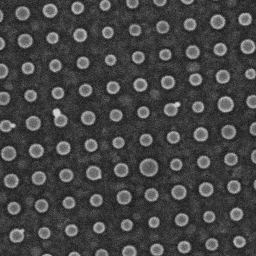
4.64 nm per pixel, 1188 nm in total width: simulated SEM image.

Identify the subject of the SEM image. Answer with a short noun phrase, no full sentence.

a regular array of raised bodies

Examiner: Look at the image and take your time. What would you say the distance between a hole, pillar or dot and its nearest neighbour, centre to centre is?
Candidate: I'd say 127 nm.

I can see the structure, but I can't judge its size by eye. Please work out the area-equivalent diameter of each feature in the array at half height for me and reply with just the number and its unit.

12.1 px